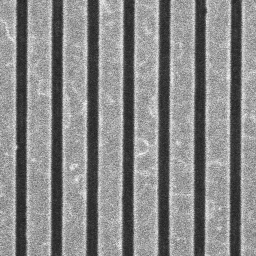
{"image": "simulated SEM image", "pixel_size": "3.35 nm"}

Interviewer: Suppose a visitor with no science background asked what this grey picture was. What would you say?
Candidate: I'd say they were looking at parallel lines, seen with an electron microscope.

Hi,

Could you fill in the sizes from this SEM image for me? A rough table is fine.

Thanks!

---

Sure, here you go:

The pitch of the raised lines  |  120 nm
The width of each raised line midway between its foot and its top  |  89.5 nanometres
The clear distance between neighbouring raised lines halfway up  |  30.1 nm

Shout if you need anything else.